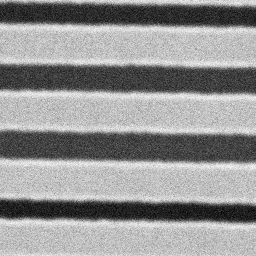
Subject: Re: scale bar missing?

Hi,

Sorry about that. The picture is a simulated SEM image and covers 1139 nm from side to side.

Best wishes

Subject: lines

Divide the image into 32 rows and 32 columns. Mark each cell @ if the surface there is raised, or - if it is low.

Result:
----------------------------@@@@
--------------------------------
--------------------------------
@@@@@@@@@@@@@@@@@@@@@@@@@@@-@@@-
@@@@@@@@@@@@@@@@@@@@@@@@@@@@@@@@
@@@@@@@@@@@@@@@@@@@@@@@@@@@@@@@@
@@@@@@@@@@@@@@@@@@@@@@@@@@@@@@@@
@@@@@@@@@@@@@@@@@@@@@@@@@@@@@@@@
--------------------------------
--------------------------------
--------------------------------
@@@@-@-@@-----------------------
@@@@@@@@@@@@@@@@@@@@@@@@@@@@@@@@
@@@@@@@@@@@@@@@@@@@@@@@@@@@@@@@@
@@@@@@@@@@@@@@@@@@@@@@@@@@@@@@@@
@@@@@@@@@@@@@@@@@@@@@@@@@@@@@@@@
--------------------@@@@@@@@@@@@
--------------------------------
--------------------------------
--------------------------------
@@@@@@@@@@@@@@@@@@@@@@@@-@-@@@-@
@@@@@@@@@@@@@@@@@@@@@@@@@@@@@@@@
@@@@@@@@@@@@@@@@@@@@@@@@@@@@@@@@
@@@@@@@@@@@@@@@@@@@@@@@@@@@@@@@@
@@@@@@@@@@@@@@@@@@@@@@@@@@@@@@@@
--------------------------------
--------------------------------
@--@----------------------------
@@@@@@@@@@@@@@@@@@@@@@@@@@@@@@@@
@@@@@@@@@@@@@@@@@@@@@@@@@@@@@@@@
@@@@@@@@@@@@@@@@@@@@@@@@@@@@@@@@
@@@@@@@@@@@@@@@@@@@@@@@@@@@@@@@@